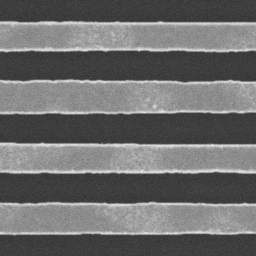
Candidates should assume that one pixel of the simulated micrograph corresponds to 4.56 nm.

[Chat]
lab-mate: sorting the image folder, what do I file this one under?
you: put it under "lines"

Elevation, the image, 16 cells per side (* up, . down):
................
****************
****************
................
................
****************
****************
................
................
****************
****************
................
................
****************
****************
................